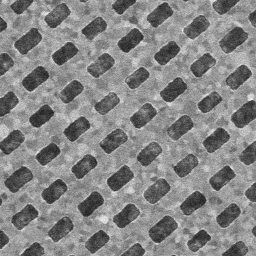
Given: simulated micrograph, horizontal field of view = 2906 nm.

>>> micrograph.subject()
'a regular array of holes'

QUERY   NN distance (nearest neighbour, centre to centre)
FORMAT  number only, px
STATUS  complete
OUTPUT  37.7